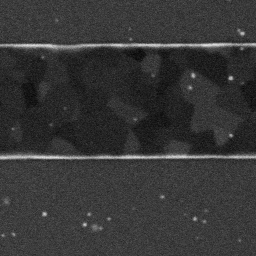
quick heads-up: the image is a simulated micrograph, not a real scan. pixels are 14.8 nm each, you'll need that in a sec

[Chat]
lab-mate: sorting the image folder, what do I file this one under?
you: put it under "wiring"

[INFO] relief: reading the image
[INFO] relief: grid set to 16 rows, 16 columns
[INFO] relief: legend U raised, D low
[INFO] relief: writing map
DDDDDDDDDDDDDDDD
DDDDDDDDDDDDDDDD
DDDDDDDDDDDDDDDD
UUUUUUUUUUUUUUUU
UUUUUUUUUUUUUUUU
UUUUUUUUUUUUUUUU
UUUUUUUUUUUUUUUU
UUUUUUUUUUUUUUUU
UUUUUUUUUUUUUUUU
UUUUUUUUUUUUUUUU
DDDDDDDDDDDDDDDD
DDDDDDDDDDDDDDDD
DDDDDDDDDDDDDDDD
DDDDDDDDDDDDDDDD
DDDDDDDDDDDDDDDD
DDDDDDDDDDDDDDDD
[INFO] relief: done